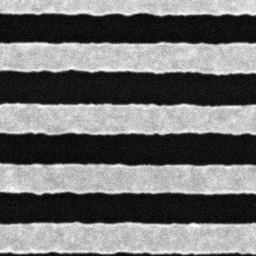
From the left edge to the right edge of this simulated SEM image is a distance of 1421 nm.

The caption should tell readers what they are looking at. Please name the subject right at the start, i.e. lines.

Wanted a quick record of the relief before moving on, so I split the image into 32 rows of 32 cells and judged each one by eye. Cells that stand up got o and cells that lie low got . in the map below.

oooooooooooooooooooooooooooooooo
oooooooooooooooooooooooooooooooo
................................
................................
................................
oooooooooo.ooo.o...ooooo.o...ooo
oooooooooooooooooooooooooooooooo
oooooooooooooooooooooooooooooooo
oooooooooooooooooooooooooooooooo
................................
................................
................................
................................
oooooooooooooooooooooooooooooooo
oooooooooooooooooooooooooooooooo
oooooooooooooooooooooooooooooooo
oooooooooooooooooooooooooooooooo
................................
................................
................................
................................
oooooooooooooooooooooooooooooooo
oooooooooooooooooooooooooooooooo
oooooooooooooooooooooooooooooooo
................................
................................
................................
................................
oooooooooooooooooooooooooooooooo
oooooooooooooooooooooooooooooooo
oooooooooooooooooooooooooooooooo
oooooooooooooooooooooooooooooooo